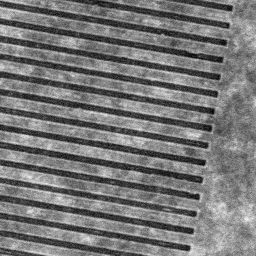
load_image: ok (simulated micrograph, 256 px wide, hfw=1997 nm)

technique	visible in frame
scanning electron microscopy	parallel lines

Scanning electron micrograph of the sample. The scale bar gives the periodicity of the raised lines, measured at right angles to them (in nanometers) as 136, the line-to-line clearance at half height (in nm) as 57.6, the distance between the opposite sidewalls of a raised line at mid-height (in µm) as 0.072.